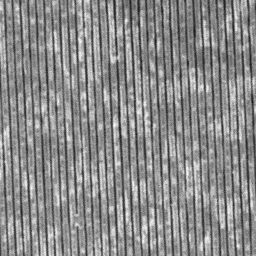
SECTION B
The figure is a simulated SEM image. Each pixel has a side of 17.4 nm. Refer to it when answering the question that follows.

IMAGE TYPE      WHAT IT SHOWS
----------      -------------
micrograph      parallel lines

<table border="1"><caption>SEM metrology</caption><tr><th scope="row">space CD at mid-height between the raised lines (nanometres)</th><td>47.7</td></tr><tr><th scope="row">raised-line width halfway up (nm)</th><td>80.2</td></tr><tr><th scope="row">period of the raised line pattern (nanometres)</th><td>136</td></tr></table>